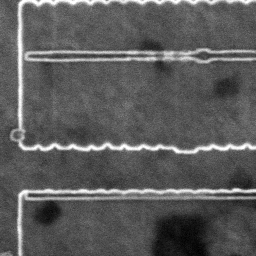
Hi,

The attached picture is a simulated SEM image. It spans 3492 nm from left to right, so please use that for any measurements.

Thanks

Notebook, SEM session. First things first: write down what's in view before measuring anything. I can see wiring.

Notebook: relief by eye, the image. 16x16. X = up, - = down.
-XXXXXXXXXXXXXXX
-XXXXXXXXXXXXXXX
-XXXXXXXXXXXXXXX
-XXXXXXXXXXXXXXX
-XXXXXXXXXXXXXXX
-XXXXXXXXXXXXXXX
-XXXXXXXXXXXXXXX
-XXXXXXXXXXXXXXX
-XXXXXXXXXXXXXXX
-----------X----
----------------
----------------
-XXXXXXXXXXXXXXX
-XXXXXXXXXXXXXXX
-XXXXXXXXXXXXXXX
-XXXXXXXXXXXXXXX